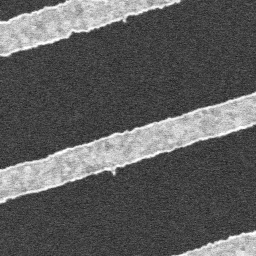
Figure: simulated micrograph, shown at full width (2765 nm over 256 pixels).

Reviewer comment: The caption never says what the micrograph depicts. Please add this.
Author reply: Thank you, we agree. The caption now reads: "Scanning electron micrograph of one or a few lines or trenches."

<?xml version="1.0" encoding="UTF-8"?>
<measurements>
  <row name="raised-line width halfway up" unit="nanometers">322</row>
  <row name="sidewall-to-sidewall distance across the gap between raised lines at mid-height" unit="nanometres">1180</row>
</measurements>